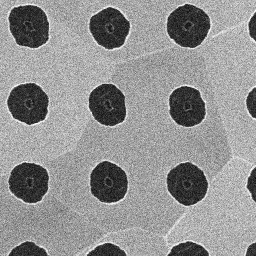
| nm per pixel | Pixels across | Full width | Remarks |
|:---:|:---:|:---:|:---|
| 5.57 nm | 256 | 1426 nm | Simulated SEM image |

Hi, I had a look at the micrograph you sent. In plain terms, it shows a regular array of ring-shaped grooves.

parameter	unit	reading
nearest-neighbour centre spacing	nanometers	431